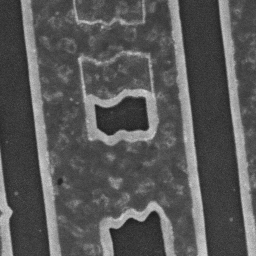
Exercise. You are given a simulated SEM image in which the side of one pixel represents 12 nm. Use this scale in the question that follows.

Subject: one or a few lines or trenches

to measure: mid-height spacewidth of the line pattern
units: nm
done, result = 576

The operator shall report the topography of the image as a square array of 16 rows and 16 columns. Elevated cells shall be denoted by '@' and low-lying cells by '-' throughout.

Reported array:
--@@@@@@@@@---@@
--@@@@@@@@@---@@
--@@@@@@@@@---@@
--@@@@@@@@@---@@
--@@@@@@@@@---@@
--@@@@@@@@@----@
--@@@@---@@@---@
--@@@@----@@---@
---@@@--@@@@---@
---@@@@@@@@@---@
---@@@@@@@@@---@
---@@@@@@@@@---@
---@@@@@@@@@---@
---@@@@@@-@@---@
---@@@@---@@@---
---@@@@----@@---